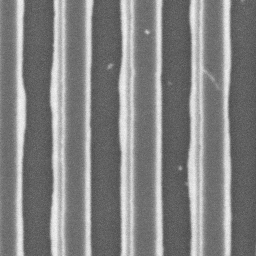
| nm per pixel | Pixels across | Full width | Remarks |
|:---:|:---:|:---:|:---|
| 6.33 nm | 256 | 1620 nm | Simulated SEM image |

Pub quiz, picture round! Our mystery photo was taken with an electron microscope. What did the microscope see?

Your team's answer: lines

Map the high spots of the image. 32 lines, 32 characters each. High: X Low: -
XX-----XXXX-----XXXX----XXXX----
XX-----XXXX-----XXXX----XXXX----
XX-----XXXX-----XXXX----XXXX----
XX-----XXXX-----XXXX----XXXX----
XX-----XXXX-----XXXX----XXXX----
XX-----XXXX-----XXXX----XXXX----
XX-----XXXX-----XXXX----XXXX----
XX-----XXXX-----XXXX----XXXX----
XX-----XXXX-----XXXX----XXXX----
XX-----XXXX-----XXXX----XXXX----
XX-----XXXX----XXXXX----XXXX----
XX-----XXXX----XXXXX----XXXX----
XX-----XXXX----XXXXX----XXXX----
XX-----XXXX-----XXXX----XXXX----
XX-----XXXX-----XXXX----XXXX----
XX-----XXXX-----XXXX----XXXX----
XX-----XXXX-----XXXX----XXXX----
XX-----XXXX-----XXXX----XXXX----
XX-----XXXX-----XXXX----XXXX----
XX-----XXXX-----XXXX----XXXX----
XX-----XXXX-----XXXX----XXXX----
XX-----XXXX-----XXXX----XXXX----
XX-----XXXX-----XXXX----XXXX----
XX-----XXXX-----XXXX----XXXX----
XX-----XXXX-----XXXX----XXXX----
XX-----XXXX-----XXXX----XXXX----
XX-----XXXX-----XXXX----XXXX----
XX-----XXXX-----XXXX----XXXX----
XX-----XXXX-----XXXX----XXXX----
XX-----XXXX----XXXXX----XXXX----
XX-----XXXX----XXXXX----XXXX----
XX-----XXXX----XXXXX----XXXX----